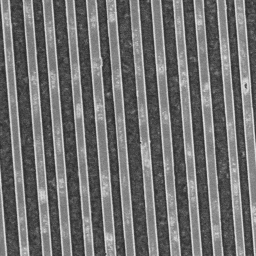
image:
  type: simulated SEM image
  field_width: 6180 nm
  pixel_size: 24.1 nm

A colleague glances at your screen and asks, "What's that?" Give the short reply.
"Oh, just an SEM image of parallel lines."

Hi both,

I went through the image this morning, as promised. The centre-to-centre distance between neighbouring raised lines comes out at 0.515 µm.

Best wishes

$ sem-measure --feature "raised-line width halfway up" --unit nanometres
202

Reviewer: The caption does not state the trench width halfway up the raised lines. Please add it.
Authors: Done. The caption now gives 313 nanometers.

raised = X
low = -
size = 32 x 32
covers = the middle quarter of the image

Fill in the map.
--XX---XX---XX----XX---XX----XX-
--XX---XX---XX----XX---XX----XX-
--XX---XX---XX----XX---XXX---XX-
--XX---XX---XX----XX---XXX---XX-
--XX---XX---XX----XX----XX---XX-
--XX---XXX--XX----XX----XX---XX-
--XX---XXX--XX----XX----XX---XX-
--XX----XX--XXX---XX----XX---XX-
---X----XX--XXX----X----XX---XX-
---X----XX---XX----X----XX---XX-
---X----XX---XX----XX---XX----X-
---X----XX---XX----XX---XX----XX
---XX---XX---XX----XX---XX----XX
---XX---XX---XX----XX---XX----XX
---XX---XX---XX----XX---XX----XX
---XX---XX---XX----XX---XXX---XX
---XX---XX---XX----XX---XXX---XX
---XX---XX---XX----XX----XX---XX
---XX---XXX--XX----XX----XX---XX
---XX---XXX--XX----XX----XX---XX
---XX----XX--XXX---XX----XX---XX
----X----XX---XX----X----XX---XX
----X----XX---XX----XX---XX---XX
----X----XX---XX----XX---XX----X
----X----XX---XX----XX---XX----X
----XX---XX---XX----XX---XX----X
----XX---XX---XX----XX---XX----X
----XX---XX---XX----XX---XX----X
----XX---XX---XX----XX---XXX---X
----XX---XX---XX----XX---XXX---X
X---XX---XX---XX----XX----XX---X
X---XX---XXX--XX----XX----XX---X